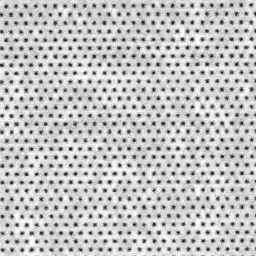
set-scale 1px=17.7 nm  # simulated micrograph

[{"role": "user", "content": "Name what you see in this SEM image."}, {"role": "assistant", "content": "a regular array of holes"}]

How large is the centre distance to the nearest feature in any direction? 164 nm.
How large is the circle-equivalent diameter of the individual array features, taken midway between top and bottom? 77.5 nm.